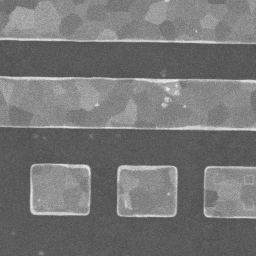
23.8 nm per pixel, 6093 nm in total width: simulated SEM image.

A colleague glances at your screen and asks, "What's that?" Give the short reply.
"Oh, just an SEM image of wiring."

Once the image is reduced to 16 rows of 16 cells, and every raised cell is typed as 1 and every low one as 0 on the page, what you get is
1111111111111111
1111111111111111
0000111111111111
0000000000000000
0000000000000000
1111111111111111
1111111111111111
1111111111111111
0000000000000000
0000000000000000
0011100011100111
0011110111100111
0011110111100111
0000000011100111
0000000000000000
0000000000000000